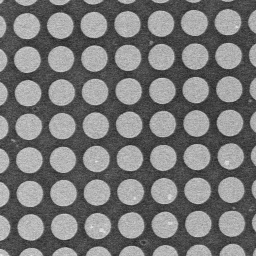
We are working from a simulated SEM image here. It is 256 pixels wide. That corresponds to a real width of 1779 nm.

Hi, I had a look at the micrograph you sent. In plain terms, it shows an array of small figures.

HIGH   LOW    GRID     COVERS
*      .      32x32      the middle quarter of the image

**...*****...*****....*****....*
*.....***......**...............
................................
................................
*.....****....****....*****...**
**...******..******...******..**
***..******..******..*******..**
***..******..******..*******..**
**...******..******...*****...**
**....****.....***.....***......
................................
................................
*.....***......***.....****....*
**...*****....*****...*****...**
***..******..******...******..**
***..******..******...******..**
***..******..******...******..**
**....****....*****....****....*
*......**.......................
................................
........................**......
**....****....*****...*****....*
**...******..******...******..**
***..******..*******..******..**
***..******..*******..******..**
**...******...*****...*****....*
**....****.....***......**......
................................
................................
*......***.....****....****....*
**...******...******..******..**
***..******..*******..******..**